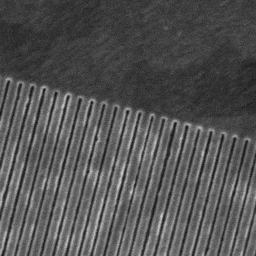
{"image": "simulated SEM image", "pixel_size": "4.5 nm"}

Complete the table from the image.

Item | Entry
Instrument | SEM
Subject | parallel lines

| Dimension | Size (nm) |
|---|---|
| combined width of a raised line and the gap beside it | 55.3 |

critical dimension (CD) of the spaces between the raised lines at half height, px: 3.4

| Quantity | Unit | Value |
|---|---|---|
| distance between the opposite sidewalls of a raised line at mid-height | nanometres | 42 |